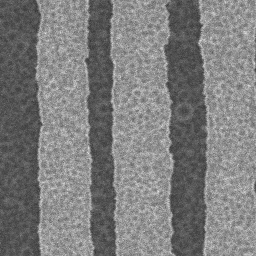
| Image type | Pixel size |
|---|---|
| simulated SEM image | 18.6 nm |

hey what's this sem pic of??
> one or a few lines or trenches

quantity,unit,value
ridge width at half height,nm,937